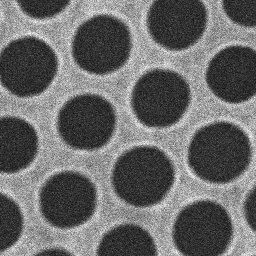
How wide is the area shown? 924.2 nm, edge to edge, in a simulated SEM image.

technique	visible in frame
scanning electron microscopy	holes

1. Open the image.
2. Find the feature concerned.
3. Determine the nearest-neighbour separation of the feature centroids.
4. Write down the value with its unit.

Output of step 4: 283 nm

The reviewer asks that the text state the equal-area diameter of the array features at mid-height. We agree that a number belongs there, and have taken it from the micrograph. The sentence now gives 0.216 um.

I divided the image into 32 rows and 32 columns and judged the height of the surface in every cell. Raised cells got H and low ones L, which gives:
HHLLLLLLLHHHHHHHHHHLLLLLLHHHLLLL
HHHLLLLLHHHHHHHHHHLLLLLLLLHHLLLL
HHHHHHHHHHHLLLLHHHLLLLLLLLHHHLLL
HHHHHHHHHHLLLLLLHHLLLLLLLLHHHHHH
HHHHHHHHHLLLLLLLHHHLLLLLLHHHHHHH
HLLLLLHHHLLLLLLLHHHHLLLLHHHHHHHH
LLLLLLLHHLLLLLLLHHHHHHHHHHHLLLLL
LLLLLLLHHLLLLLLLHHHHHHHHHHLLLLLL
LLLLLLLHHHLLLLLHHHHHHHHHHHLLLLLL
LLLLLLLHHHHHHHHHHHLLLLLHHHLLLLLL
LLLLLLHHHHHHHHHHHLLLLLLHHHLLLLLL
HLLLLHHHHHHHHHHHLLLLLLLLHHHLLLLL
HHHHHHHHHLLLLHHHLLLLLLLLHHHHLLLH
HHHHHHHHLLLLLLHHLLLLLLLHHHHHHHHH
HHHHHHHLLLLLLLHHHLLLLLLHHHHHHHHH
LLLLHHHLLLLLLLHHHHLLLLHHHHLLLHHH
LLLLLHHLLLLLLLHHHHHHHHHHHLLLLLLH
LLLLLHHHLLLLLLHHHHHHHHHHLLLLLLLH
LLLLLHHHHLLLHHHHHLLLHHHHLLLLLLLH
LLLLHHHHHHHHHHHLLLLLLHHLLLLLLLLH
LLLLHHHHHHHHHHLLLLLLLLHHLLLLLLLH
LLHHHHHHLHHHHHLLLLLLLLHHLLLLLLLH
HHHHHHLLLLLHHHLLLLLLLLHHHHLLLHHH
HHHHHLLLLLLLHHLLLLLLLHHHHHHHHHHH
LHHHHLLLLLLLHHHLLLLLLHHHHHHHHHHL
LLHHHLLLLLLLHHHHLLLHHHHHLLLHHHLL
LLLHHLLLLLLLHHHHHHHHHHLLLLLLHHLL
LLLHHHLLLLLHHHHHHHHHHHLLLLLLLHHL
LLLHHHHLLHHHHHLLLLHHHHLLLLLLLHHL
LLLHHHHHHHHHHLLLLLLHHHLLLLLLLHHH
LLHHHHHHHHHHLLLLLLLHHHLLLLLLLHHH
HHHHHLLLLHHHLLLLLLLLHHLLLLLLHHHH